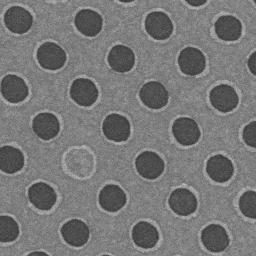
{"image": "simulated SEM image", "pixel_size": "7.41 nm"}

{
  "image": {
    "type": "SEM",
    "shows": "a regular array of holes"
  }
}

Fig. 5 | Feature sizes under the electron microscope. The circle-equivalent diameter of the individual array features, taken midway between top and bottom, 214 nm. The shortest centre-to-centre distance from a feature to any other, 362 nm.